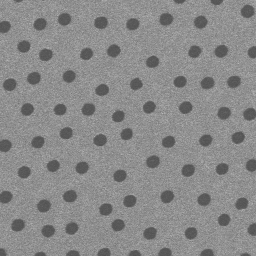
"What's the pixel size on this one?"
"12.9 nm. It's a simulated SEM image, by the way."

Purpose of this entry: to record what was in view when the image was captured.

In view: a regular array of holes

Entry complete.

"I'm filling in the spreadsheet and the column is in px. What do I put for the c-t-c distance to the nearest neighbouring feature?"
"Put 26.8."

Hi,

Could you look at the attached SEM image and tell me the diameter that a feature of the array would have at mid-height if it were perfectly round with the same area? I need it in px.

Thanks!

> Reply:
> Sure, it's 12.9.